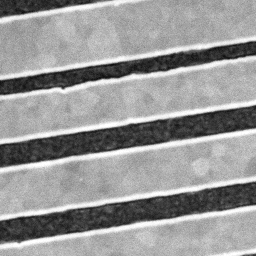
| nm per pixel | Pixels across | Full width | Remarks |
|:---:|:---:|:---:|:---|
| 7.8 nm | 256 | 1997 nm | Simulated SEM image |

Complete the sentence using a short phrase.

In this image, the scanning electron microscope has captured one or a few lines or trenches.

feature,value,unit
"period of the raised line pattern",568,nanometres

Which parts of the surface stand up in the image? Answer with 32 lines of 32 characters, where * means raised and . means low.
.............*******************
......**************************
********************************
********************************
********************************
****************************....
*********************...........
***************..............***
********................********
**................**************
...........*********************
.....***************************
********************************
****************************....
*********************...........
***************.................
*********......................*
**......................********
..................**************
...........*********************
.....***************************
********************************
*******************************.
*************************.......
******************..............
************....................
******......................****
......................**********
...............*****************
........************************
...*****************************
*******************************.